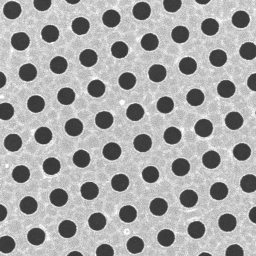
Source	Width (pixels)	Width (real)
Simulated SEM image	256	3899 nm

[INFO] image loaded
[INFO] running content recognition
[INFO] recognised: a regular array of holes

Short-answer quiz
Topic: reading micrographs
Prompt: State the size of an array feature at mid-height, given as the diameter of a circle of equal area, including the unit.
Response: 281 nm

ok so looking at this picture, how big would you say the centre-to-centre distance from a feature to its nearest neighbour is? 0.475 micrometres